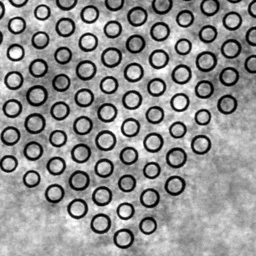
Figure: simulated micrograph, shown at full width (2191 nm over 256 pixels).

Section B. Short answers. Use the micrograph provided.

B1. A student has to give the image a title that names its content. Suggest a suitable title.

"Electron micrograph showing a regular array of ring-shaped grooves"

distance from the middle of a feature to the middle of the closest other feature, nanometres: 233